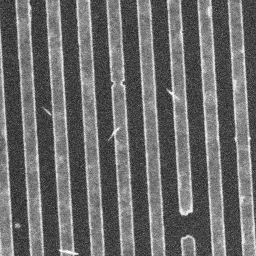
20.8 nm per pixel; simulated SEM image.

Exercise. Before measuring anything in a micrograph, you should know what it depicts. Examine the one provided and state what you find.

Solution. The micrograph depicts parallel lines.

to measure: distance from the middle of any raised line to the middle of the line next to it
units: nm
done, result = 630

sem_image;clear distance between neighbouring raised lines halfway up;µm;0.358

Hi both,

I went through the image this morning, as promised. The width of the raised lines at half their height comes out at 273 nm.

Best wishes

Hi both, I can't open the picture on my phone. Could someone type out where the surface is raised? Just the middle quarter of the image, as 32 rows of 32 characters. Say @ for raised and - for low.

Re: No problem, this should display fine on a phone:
----@@@-----@@@----@@@-----@@@--
----@@@-----@@@----@@@-----@@@--
----@@@-----@@@----@@@@----@@@--
----@@@-----@@@-----@@@----@@@--
----@@@-----@@@-----@@@----@@@--
----@@@@----@@@-----@@@----@@@--
-----@@@----@@@-----@@@----@@@--
-----@@@----@@@-----@@@----@@@--
-----@@@----@@@-----@@@----@@@--
-----@@@----@@@-----@@@----@@@@-
-----@@@----@@@-----@@@-----@@@-
-----@@@----@@@-----@@@-----@@@-
-----@@@----@@@@----@@@-----@@@-
-----@@@----@@@@----@@@-----@@@-
-----@@@-----@@@----@@@-----@@@-
@----@@@-----@@@----@@@-----@@@-
@----@@@-----@@@----@@@-----@@@-
@----@@@-----@@@----@@@-----@@@-
@----@@@-----@@@----@@@-----@@@-
@----@@@-----@@@----@@@@----@@@-
@----@@@-----@@@-----@@@----@@@-
@----@@@-----@@@-----@@@----@@@-
@----@@@@----@@@-----@@@----@@@-
@----@@@@----@@@-----@@@----@@@-
@-----@@@----@@@-----@@@----@@@-
@-----@@@----@@@-----@@@----@@@-
@-----@@@----@@@-----@@@----@@@@
@-----@@@----@@@-----@@@-----@@@
@-----@@@----@@@-----@@@-----@@@
@-----@@@----@@@@----@@@-----@@@
@-----@@@----@@@@----@@@-----@@@
@-----@@@-----@@@----@@@-----@@@